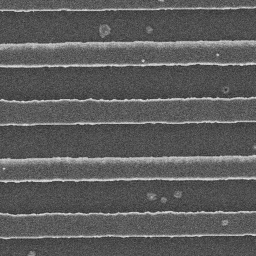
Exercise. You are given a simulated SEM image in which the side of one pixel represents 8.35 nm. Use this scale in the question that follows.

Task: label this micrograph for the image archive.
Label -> lines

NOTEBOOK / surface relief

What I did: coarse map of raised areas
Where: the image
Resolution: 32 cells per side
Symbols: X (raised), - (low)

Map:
XXXXXXXXXXXXXXXXXXXXXXXXXXXXXXXX
--------------------------------
--------------------------------
--------------------------------
--------------------------------
-----------X-XX-XXXX-XXXXXXXXXXX
XXXXXXXXXXXXXXXXXXXXXXXXXXXXXXXX
XXXXXXXXXXXXXXXXXXXXXXXXXXXXXXXX
--------------------------------
--------------------------------
--------------------------------
--------------------------------
X------XXXXXX-XXXXXXXXXXXXXXXXXX
XXXXXXXXXXXXXXXXXXXXXXXXXXXXXXXX
XXXXXXXXXXXXXXXXXXXXXXXXXXXXXXXX
XXXXX---------------------------
--------------------------------
--------------------------------
--------------------------------
--------------------------------
XXXXXXXXXXXXXXXXXXXXXXXXXXXXXXXX
XXXXXXXXXXXXXXXXXXXXXXXXXXXXXXXX
XXXXXXXXXXXXXX------------------
--------------------------------
--------------------------------
--------------------------------
--------------------XX---X-X-XXX
XXXXXXXXXXXXXXXXXXXXXXXXXXXXXXXX
XXXXXXXXXXXXXXXXXXXXXXXXXXXXXXXX
XXXXXXXXXXXXX--X--X--X----------
--------------------------------
--------------------------------